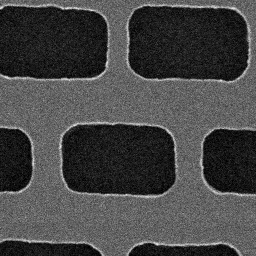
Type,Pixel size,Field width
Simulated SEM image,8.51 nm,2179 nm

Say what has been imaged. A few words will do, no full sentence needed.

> holes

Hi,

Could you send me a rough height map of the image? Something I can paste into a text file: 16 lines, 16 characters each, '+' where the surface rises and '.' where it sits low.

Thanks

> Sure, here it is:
....+++++....+++
.......+.......+
.......+........
.......+........
......++.......+
++++++++++++++++
++++++++++++++++
++++++++++++++++
..++.......++...
..++.......++...
..++.......++...
..++.......++...
++++++++++++++++
++++++++++++++++
++++++++++++++++
......++......++